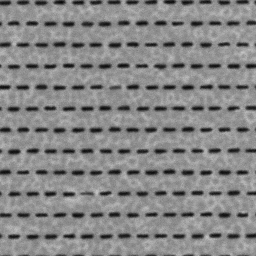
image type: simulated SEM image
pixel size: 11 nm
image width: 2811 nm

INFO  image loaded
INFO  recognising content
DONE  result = a regular array of holes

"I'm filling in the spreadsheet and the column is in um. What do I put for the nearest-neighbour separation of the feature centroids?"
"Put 0.198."